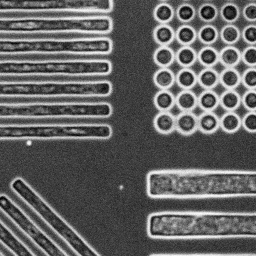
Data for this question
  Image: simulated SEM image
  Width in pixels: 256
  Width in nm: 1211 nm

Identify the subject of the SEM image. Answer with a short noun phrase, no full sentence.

groups of lines, slits or small figures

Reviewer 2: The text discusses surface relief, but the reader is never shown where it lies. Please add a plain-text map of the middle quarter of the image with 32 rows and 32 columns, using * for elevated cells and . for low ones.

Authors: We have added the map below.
...........*********************
...........*********************
*.....*****************....**...
***********************....**...
***********************....**...
...........*************..****..
...........*********************
..........**************..***...
***********************....**...
***********************....*....
...........*************...**...
............********************
...........*******************.*
***********************....**...
***********************.........
..........*************....*....
...........*************...**...
...........*********************
********************************
********************************
********************************
********************************
********************************
********************************
********************************
********************************
********************************
**********************..........
*********************...........
*********************...........
*********************...........
*********************...........